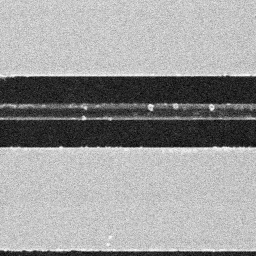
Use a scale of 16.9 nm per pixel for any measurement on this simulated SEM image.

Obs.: lines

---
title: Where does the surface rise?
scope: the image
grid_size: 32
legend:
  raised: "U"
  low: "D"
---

UUUUUUUUUUUUUUUUUUUUUUUUUUUUUUUU
UUUUUUUUUUUUUUUUUUUUUUUUUUUUUUUU
UUUUUUUUUUUUUUUUUUUUUUUUUUUUUUUU
UUUUUUUUUUUUUUUUUUUUUUUUUUUUUUUU
UUUUUUUUUUUUUUUUUUUUUUUUUUUUUUUU
UUUUUUUUUUUUUUUUUUUUUUUUUUUUUUUU
UUUUUUUUUUUUUUUUUUUUUUUUUUUUUUUU
UUUUUUUUUUUUUUUUUUUUUUUUUUUUUUUU
UUUUUUUUUUUUUUUUUUUUUUUUUUUUUUUU
UUDUDDDDDDDDDDDDDDDDDDDDDDDDDDDD
DDDDDDDDDDDDDDDDDDDDDDDDDDDDDDDD
DDDDDDDDDDDDDDDDDDDDDDDDDDDDDDDD
DDDDDDDDDDDDDDDDDDDDDDDDDDDDDDDD
UUUUUUUUUUUUUUUUUUUUUUUUUUUUUUUU
UUUUUUUUUUUUUUUUUUUUUUUUUUUUUUUU
DDDDDDDDDDDDDDDDDDDDDDDDDDDDDDDD
DDDDDDDDDDDDDDDDDDDDDDDDDDDDDDDD
DDDDDDDDDDDDDDDDDDDDDDDDDDDDDDDD
DUDDDDDUDDUDUUDDDDDDDDDDDDUUUUUU
UUUUUUUUUUUUUUUUUUUUUUUUUUUUUUUU
UUUUUUUUUUUUUUUUUUUUUUUUUUUUUUUU
UUUUUUUUUUUUUUUUUUUUUUUUUUUUUUUU
UUUUUUUUUUUUUUUUUUUUUUUUUUUUUUUU
UUUUUUUUUUUUUUUUUUUUUUUUUUUUUUUU
UUUUUUUUUUUUUUUUUUUUUUUUUUUUUUUU
UUUUUUUUUUUUUUUUUUUUUUUUUUUUUUUU
UUUUUUUUUUUUUUUUUUUUUUUUUUUUUUUU
UUUUUUUUUUUUUUUUUUUUUUUUUUUUUUUU
UUUUUUUUUUUUUUUUUUUUUUUUUUUUUUUU
UUUUUUUUUUUUUUUUUUUUUUUUUUUUUUUU
UUUUUUUUUUUUUUUUUUUUUUUUUUUUUUUU
DDDDDDDDDDDDDDDDDDDDDDDDDDDDDDDD